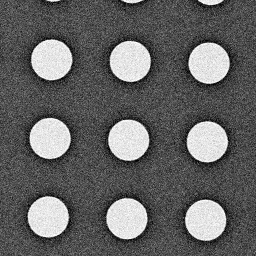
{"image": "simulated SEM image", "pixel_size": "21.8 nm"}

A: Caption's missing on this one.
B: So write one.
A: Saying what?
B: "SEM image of an array of small figures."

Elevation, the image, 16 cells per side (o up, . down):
................
................
................
..oo...oo...oo..
..oo...oo...oo..
................
................
...o............
..oo...oo...oo..
..oo...oo...oo..
................
................
..oo............
..oo...oo...oo..
..oo...oo...oo..
................